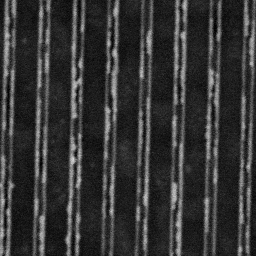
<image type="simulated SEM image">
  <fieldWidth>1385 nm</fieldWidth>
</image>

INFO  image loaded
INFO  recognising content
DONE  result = parallel lines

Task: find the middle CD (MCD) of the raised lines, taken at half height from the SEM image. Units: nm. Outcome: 56.1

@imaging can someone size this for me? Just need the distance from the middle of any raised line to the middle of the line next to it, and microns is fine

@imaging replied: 0.185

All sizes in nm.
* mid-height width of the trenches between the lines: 132